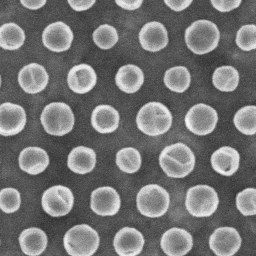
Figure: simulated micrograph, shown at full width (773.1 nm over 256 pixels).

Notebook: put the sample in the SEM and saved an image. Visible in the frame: a regular array of raised bodies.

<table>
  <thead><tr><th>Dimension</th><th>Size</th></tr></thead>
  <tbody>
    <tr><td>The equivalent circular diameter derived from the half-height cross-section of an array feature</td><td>86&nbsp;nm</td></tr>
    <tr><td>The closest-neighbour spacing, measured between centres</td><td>141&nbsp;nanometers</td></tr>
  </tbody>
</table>